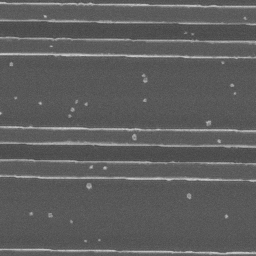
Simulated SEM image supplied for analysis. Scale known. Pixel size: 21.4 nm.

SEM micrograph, lines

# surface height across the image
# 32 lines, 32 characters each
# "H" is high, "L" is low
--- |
HHHHHHHHHHLLLLLLLLLLLLLLLLLLLLLL
HHHHHHHHHHHHHHHHHHHHHHHHHHHHHHHH
HHHHHHHHHHHHHHHHHHHHHHHHHHHHHHHH
LLLLLLLLLLLLLLLLLLLLLLLLLLLLLLLL
LLLLLLLLLLLLLLLLLLLLLLLLLLLLLLLL
HHHHHHHHHHHHHHHHHHHHHHHHHHHHHHHH
HHHHHHHHHHHHHHHHHHHHHHHHHHHHHHHH
LLLLLLLLLLLLLLLLLLLLLLLLLLLLLLLL
LLLLLLLLLLLLLLLLLLLLLLLLLLLLLLLL
LLLLLLLLLLLLLLLLLLLLLLLLLLLLLLLL
LLLLLLLLLLLLLLLLLLLLLLLLLLLLLLLL
LLLLLLLLLLLLLLLLLLLLLLLLLLLLLLLL
LLLLLLLLLLLLLLLLLLLLLLLLLLLLLLLL
LLLLLLLLLLLLLLLLLLLLLLLLLLLLLLLL
LLLLLLLLLLLLLLLLLLLLLLLLLLLLLLLL
LLLLLLLLLLLLLLLLLLLLLLLLLLLLLLLL
HHHHHHHHHHHHHHHHHHHHHHHHHHHHHHHH
HHHHHHHHHHHHHHHHHHHHHHHHHHHHHHHH
LLLLLLLLLLLLLLLLLLLLLLLLLLLLLLLL
LLLLLLLLLLLLLLLLLLLLLLLLLLLLLLLL
HHHHHHHHHHHHHHHHHHHHHHHHHHHHHHHH
HHHHHHHHHHHHHHHHHHHHHHHHHHHHHHHH
LLLLLLLLLLLLLLLLLLLLLLLLLLLLLLLH
LLLLLLLLLLLLLLLLLLLLLLLLLLLLLLLL
LLLLLLLLLLLLLLLLLLLLLLLLLLLLLLLL
LLLLLLLLLLLLLLLLLLLLLLLLLLLLLLLL
LLLLLLLLLLLLLLLLLLLLLLLLLLLLLLLL
LLLLLLLLLLLLLLLLLLLLLLLLLLLLLLLL
LLLLLLLLLLLLLLLLLLLLLLLLLLLLLLLL
LLLLLLLLLLLLLLLLLLLLLLLLLLLLLLLL
LLLLLLLLLLLLLLLLLLLLLLLLLLLLLLLL
HHHHHHHHHHHHHHHHHHHHHHLHLLLLLLLL